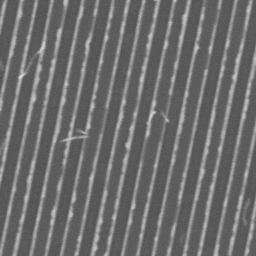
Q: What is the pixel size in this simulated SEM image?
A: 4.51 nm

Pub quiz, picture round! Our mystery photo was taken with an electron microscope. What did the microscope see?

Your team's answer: parallel lines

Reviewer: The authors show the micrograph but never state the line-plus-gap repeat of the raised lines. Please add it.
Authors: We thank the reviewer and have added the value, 136 nm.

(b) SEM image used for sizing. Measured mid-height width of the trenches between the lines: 0.0569 microns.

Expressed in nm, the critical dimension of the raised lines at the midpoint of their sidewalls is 79.6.